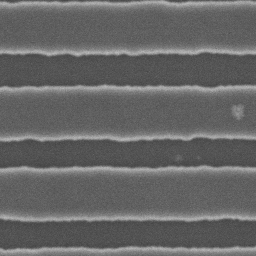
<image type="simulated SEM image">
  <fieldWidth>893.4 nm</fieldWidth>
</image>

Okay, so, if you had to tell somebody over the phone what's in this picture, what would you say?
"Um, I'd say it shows lines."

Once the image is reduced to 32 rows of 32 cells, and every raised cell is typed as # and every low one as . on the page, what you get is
################################
################################
################################
################################
################################
################################
#########################.######
................................
................................
................................
................................
################################
################################
################################
################################
################################
################################
##...#.........#................
................................
................................
................................
################################
################################
################################
################################
################################
################################
...######..#...........#........
................................
................................
................................
################################